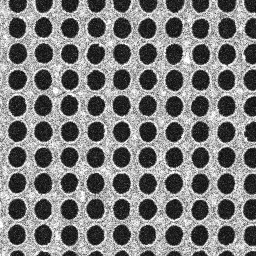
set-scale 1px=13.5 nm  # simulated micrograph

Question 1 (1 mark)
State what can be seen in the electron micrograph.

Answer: a regular array of holes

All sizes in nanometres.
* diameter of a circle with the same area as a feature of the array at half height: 264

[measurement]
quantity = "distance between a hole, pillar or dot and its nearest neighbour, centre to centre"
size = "0.348 µm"